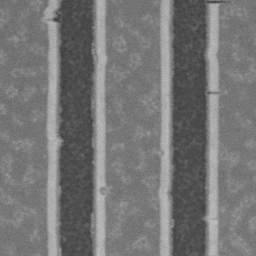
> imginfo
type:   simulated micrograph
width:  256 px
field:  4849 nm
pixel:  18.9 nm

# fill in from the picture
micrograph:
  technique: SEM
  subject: one or a few lines or trenches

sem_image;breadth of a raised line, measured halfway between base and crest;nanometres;1240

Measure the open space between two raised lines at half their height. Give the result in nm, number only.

904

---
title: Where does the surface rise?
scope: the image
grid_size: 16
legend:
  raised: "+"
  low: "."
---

+++...++++...+++
+++...++++...+++
+++...++++...+++
+++...++++...+++
+++...++++...+++
+++...++++...+++
+++...++++...+++
+++...++++...+++
+++...++++...+++
+++...++++...+++
+++...++++...+++
+++...++++...+++
+++...++++...+++
+++...++++...+++
+++...++++...+++
+++...++++...+++